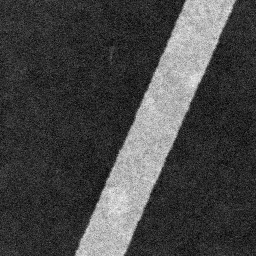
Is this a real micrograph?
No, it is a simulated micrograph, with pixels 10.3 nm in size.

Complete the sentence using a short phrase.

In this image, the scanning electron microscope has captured one or a few lines or trenches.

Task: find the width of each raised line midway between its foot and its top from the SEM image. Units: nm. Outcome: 456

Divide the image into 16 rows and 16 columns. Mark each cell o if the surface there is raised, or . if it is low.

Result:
...........ooo..
...........ooo..
...........ooo..
..........ooo...
..........ooo...
.........ooo....
.........ooo....
........ooo.....
........ooo.....
........ooo.....
.......ooo......
.......ooo......
......ooo.......
......ooo.......
.....ooo........
.....ooo........